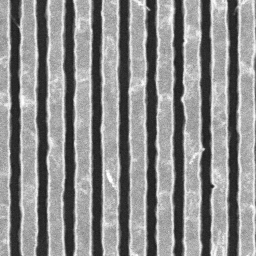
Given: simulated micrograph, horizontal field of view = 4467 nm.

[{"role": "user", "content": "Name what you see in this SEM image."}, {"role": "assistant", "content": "parallel lines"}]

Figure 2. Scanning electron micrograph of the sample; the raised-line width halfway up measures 0.303 um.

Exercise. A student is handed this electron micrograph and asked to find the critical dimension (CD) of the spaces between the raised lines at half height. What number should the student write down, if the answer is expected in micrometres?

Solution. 0.181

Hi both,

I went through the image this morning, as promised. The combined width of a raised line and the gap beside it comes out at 475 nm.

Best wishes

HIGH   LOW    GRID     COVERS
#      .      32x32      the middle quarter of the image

...####..#####..#####..#####..##
...####..####...#####..#####..##
...####..####....####..#####..##
...####...###...#####..#####..##
...####...####..#####..#####..##
...####...####..####...####...##
...####...####..####...####...##
...####...####..####...####...##
..#####..#####..####...####..###
..#####...####..####...####...##
...####...####..####...####...##
...####...####..#####..####...##
...####...####..#####..####...##
...####...####..#####..####...##
...####...####..####...#####..##
..#####..#####..####...####...##
...####..#####..#####..####...##
...####..#####..#####..####...##
...####..#####..#####..####...##
...####..#####..#####..####...##
...####..#####...####..####...##
...####...####..#####..####...##
...####...####...####..####...##
...####...####...####..####...##
...####...####...####..####...##
...####...####...####..#####..##
...####...####..#####..#####..##
...####...####...###...#####..##
...####...####...####..#####..##
...####...####...####..#####..##
...####...####...####..####...##
...####...####...####..####...##